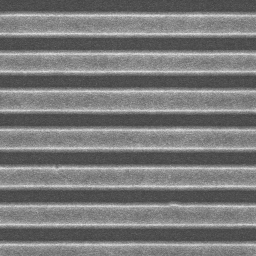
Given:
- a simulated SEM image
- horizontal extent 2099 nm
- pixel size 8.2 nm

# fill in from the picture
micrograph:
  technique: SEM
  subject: parallel lines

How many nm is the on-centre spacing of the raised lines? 313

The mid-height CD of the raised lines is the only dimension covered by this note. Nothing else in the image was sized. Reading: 188 nm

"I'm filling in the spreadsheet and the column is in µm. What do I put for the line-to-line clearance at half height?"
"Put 0.125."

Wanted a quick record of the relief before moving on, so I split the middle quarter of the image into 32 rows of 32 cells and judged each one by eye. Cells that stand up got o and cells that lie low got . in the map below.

oooooooooooooooooooooooooooooooo
oooooooooooooooooooooooooooooooo
................................
................................
................................
................................
.ooooooo.......ooo......o...oo..
oooooooooooooooooooooooooooooooo
oooooooooooooooooooooooooooooooo
oooooooooooooooooooooooooooooooo
oooooooooooooooooooooooooooooooo
oooooooooooooooooooooooooooooooo
................................
................................
................................
................................
oooooooooooooooooooooooooooooooo
oooooooooooooooooooooooooooooooo
oooooooooooooooooooooooooooooooo
oooooooooooooooooooooooooooooooo
oooooooooooooooooooooooooooooooo
oooooooooooooooooooooooooooooooo
................................
................................
................................
................................
oooooooooooooooooooooooooooooooo
oooooooooooooooooooooooooooooooo
oooooooooooooooooooooooooooooooo
oooooooooooooooooooooooooooooooo
oooooooooooooooooooooooooooooooo
................................